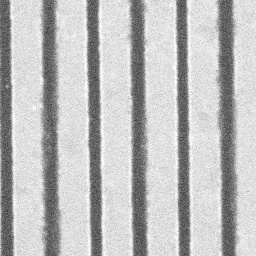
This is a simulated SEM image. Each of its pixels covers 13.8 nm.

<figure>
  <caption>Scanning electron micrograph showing lines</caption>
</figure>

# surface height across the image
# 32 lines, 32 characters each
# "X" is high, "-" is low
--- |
XX---XX----XX---XX----XX---XX---
XX---XX----XX---XX----XX---XX---
XX---XX----XX---XX----XX---XX---
XX---XX----XX---XX----XX---XX---
XX---XX----XX---XX----XX---XX---
XX---XX----XX---XX----XX---XX---
XX---XX----XX---XX----XX---XX---
XX---XX----XX---XX----XX---XX---
XX---XX----XX---XX----XX---XX---
XX---XX----XX---XX----XX---XX---
XX---XX----XX---XX----XX---XX---
XX---XX----XX---XX----XX---XX---
XX---XX----XX---XX----XX---XX---
XX---XX----XX---XX----XX---XX---
XX---XX----XX---XX----XX---XX---
XX---XX----XX---XX----XX---XX---
XX---XX----XX---XX----XX---XX---
XX---XX----XX---XX----XX---XX---
XX---XX----XX---XX----XX---XX---
XX---XX----XX---XX----XX---XX---
XX---XX----XX---XX----XX---XXX--
XX---XX----XX---XX----XX---XXX--
XX---XX----XX---XX----XX---XXX--
XX---XX----XX---XX----XX---XXX--
XX---XX----XX---XXX---XX---XXX--
XX---XX----XX---XX----XX---XXX--
XX---XX----XX---XXX---XX---XXX--
XX---XX----XX---XXX---XX---XXX--
XX---XX----XX---XXX---XX---XXX--
XX---XX----XX---XXX---XX---XXX--
XX---XX----XX---XXX---XX---XXX--
XX---XX----XX---XXX---XX---XXX--